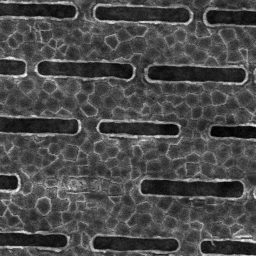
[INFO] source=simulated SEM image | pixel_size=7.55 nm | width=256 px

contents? holes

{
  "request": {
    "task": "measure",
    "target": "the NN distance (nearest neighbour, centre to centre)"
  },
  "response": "603 nm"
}